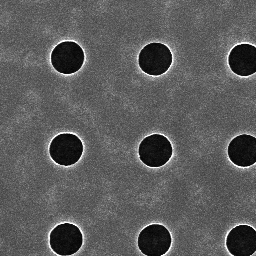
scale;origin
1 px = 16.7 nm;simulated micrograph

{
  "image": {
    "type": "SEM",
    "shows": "holes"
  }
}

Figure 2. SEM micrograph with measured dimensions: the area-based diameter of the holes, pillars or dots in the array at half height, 0.555 microns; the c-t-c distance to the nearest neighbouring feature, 1470 nanometers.